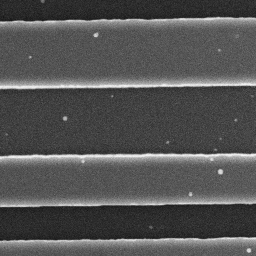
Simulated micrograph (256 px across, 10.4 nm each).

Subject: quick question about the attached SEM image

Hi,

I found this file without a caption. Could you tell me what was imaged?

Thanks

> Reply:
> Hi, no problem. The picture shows lines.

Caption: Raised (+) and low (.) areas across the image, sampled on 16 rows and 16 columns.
................
++++++++++++++++
++++++++++++++++
++++++++++++++++
++++++++++++++++
................
................
................
................
................
++++++++++++++++
++++++++++++++++
++++++++++++++++
................
................
++++++++++++++++